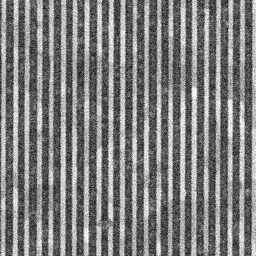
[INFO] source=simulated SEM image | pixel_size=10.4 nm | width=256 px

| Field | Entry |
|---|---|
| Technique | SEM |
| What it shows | parallel lines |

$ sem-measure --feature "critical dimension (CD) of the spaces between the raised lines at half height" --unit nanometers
93.9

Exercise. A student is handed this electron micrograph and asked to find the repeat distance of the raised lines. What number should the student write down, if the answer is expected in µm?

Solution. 0.125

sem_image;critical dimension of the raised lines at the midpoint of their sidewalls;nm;36.5